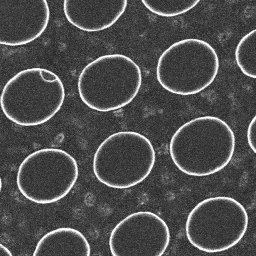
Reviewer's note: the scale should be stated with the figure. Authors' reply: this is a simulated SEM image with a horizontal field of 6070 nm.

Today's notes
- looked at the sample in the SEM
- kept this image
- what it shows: raised bodies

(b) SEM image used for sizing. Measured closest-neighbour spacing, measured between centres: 1860 nm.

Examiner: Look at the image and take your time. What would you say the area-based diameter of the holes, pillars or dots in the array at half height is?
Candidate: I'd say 1.36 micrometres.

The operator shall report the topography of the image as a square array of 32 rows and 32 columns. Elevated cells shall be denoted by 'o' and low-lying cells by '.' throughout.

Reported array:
oooooo..oooooooo..oooooo........
oooooo..ooooooo....oooo.........
oooooo...ooooo..................
oooooo....ooo...................
ooooo..........................o
.o....................oooo....oo
.....................oooooo...oo
............oooo....ooooooo...oo
...........oooooo...ooooooo...oo
..ooooo...oooooooo..ooooooo....o
.ooooooo..ooooooo...oooooo......
oooooooo..ooooooo.....oo........
oooooooo..oooooo................
ooooooo.....ooo.................
.ooooo..........................
...o...................ooooo...o
......................ooooooo..o
.............ooooo....ooooooo..o
............ooooooo..oooooooo...
....ooooo...ooooooo...ooooooo...
...oooooo...ooooooo...oooooo....
..oooooooo..ooooooo....oooo.....
..ooooooo....ooooo..............
...oooooo.......................
...ooooo........................
.........................ooooo..
........................ooooooo.
...............ooooo....ooooooo.
..............ooooooo..oooooooo.
......oooo....ooooooo..ooooooo..
.....oooooo...ooooooo...ooooo...
o...ooooooo...oooooo............